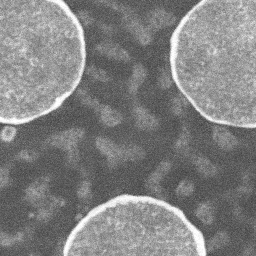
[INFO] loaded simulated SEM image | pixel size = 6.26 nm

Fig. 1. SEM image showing raised bodies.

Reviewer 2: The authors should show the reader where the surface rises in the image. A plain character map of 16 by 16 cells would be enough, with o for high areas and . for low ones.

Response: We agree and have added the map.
oooo........oooo
ooooo......ooooo
ooooo......ooooo
ooooo......ooooo
ooooo......ooooo
ooooo......ooooo
oooo........oooo
o............ooo
................
................
................
................
.......oo.......
......ooooo.....
.....ooooooo....
....ooooooooo...